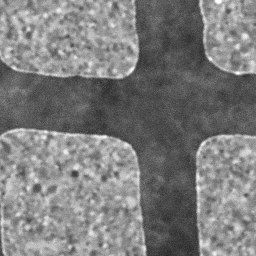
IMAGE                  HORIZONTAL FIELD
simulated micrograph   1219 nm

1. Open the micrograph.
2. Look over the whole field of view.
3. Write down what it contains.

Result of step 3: raised bodies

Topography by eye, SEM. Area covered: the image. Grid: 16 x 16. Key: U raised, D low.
UUUUUUUUDDDDDUUU
UUUUUUUUDDDDDUUU
UUUUUUUUUDDDDUUU
UUUUUUUUUDDDDUUU
DDUUUUUUDDDDDDDU
DDDDDDDDDDDDDDDD
DDDDDDDDDDDDDDDD
DDDDDDDDDDDDDDDD
UUUUUUDDDDDDDDUU
UUUUUUUUDDDDUUUU
UUUUUUUUUDDDUUUU
UUUUUUUUUDDDUUUU
UUUUUUUUUDDDUUUU
UUUUUUUUUDDDUUUU
UUUUUUUUUDDDUUUU
UUUUUUUUUDDDDUUU